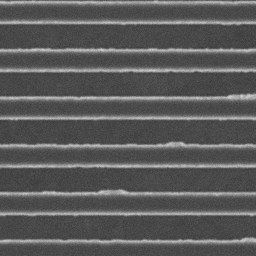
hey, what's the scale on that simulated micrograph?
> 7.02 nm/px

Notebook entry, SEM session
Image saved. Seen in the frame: lines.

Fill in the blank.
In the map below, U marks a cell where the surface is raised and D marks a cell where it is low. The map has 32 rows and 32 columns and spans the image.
UUUUUUUUUUUUUUUUUUUUUUUUUUUUUUUU
UUUUUUUUUUUUUUUUUUUUUUUUUUUUUUUU
UUUUUUUUUUUUUUUUUUUUUUUUUUUUUUUU
DDDDDDDDDDDDDDDDDDDDDDDDDDDDDDDD
DDDDDDDDDDDDDDDDDDDDDDDDDDDDDDDD
DDDDDDDDDDDDDDDDDDDDDDDDDDDDDDDD
UUUUUUUUUUUUUUUUUUUUUUUUUUUUUUUU
UUUUUUUUUUUUUUUUUUUUUUUUUUUUUUUU
UUUUUUUUUUUUUUUUUUUUUUUUUUUUUUUU
DDDDDDDDDDDDDDDDDDDDDDDDDDDDDDDD
DDDDDDDDDDDDDDDDDDDDDDDDDDDDDDDD
DDDDDDDDDDDDDDDDDDDDDDDDDDDDDDDD
UUUUUUUUUUUUUUUUUUUUUUUUUUUUUUUU
UUUUUUUUUUUUUUUUUUUUUUUUUUUUUUUU
UUUUUUUUUUUUUUUUUUUUUUUUUUUUUUUU
DDDDDDDDDDDDDDDDDDDDDDDDDDDDDDDD
DDDDDDDDDDDDDDDDDDDDDDDDDDDDDDDD
DDDDDDDDDDDDDDDDDDDDDDDDDDDDDDDD
UUUUUUUUUUUUUUUUUUUUUUUUUUUUUUUU
UUUUUUUUUUUUUUUUUUUUUUUUUUUUUUUU
UUUUUUUUUUUUUUUUUUUUUUUUUUUUUUUU
DDDDDDDDDDDDDDDDDDDDDDDDDDDDDDDD
DDDDDDDDDDDDDDDDDDDDDDDDDDDDDDDD
DDDDDDDDDDDDDDDDDDDDDDDDDDDDDDDD
UUUUUUUUUUUUUUUUUUUUUUUUUUUUUUUU
UUUUUUUUUUUUUUUUUUUUUUUUUUUUUUUU
UUUUUUUUUUUUUUUUUUUUUUUUUUUUUUUU
DDDDDDDDDDDDDDDDDDDDDDDDDDDDDDDD
DDDDDDDDDDDDDDDDDDDDDDDDDDDDDDDD
DDDDDDDDDDDDDDDDDDDDDDDDDDDDDDDD
UUUUUUUUUUUUUUUUUUUUUUUUUUUUUUUU
UUUUUUUUUUUUUUUUUUUUUUUUUUUUUUUU